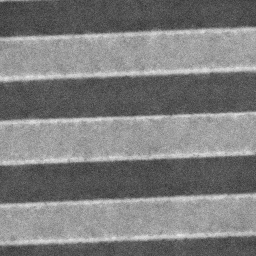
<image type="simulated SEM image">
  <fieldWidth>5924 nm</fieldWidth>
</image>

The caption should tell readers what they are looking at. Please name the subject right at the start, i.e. lines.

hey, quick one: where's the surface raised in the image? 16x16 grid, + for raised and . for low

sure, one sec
................
................
++++++++++++++++
++++++++++++++++
+++++++++.......
................
................
.......+++++++++
++++++++++++++++
++++++++++++++++
................
................
..........++++++
++++++++++++++++
++++++++++++++++
................